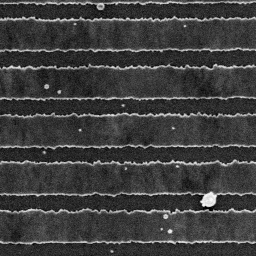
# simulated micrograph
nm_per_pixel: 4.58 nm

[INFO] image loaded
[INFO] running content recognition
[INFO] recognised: lines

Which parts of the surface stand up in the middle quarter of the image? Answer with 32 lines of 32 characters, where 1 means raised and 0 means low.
00000011111000000010100111100000
11111111111111111111111111111111
11111111111111111111111111111111
11111111111111111111111111111111
11111111111111111111111111111111
11111111111111111111111111111111
11111111111111111111111111111111
11111111111111111111111111111111
11111111111111111111111111111111
00000000000000000000000000000000
00000000000000000000000000000000
00000000000000000000000000000000
00100010000001110110010110111000
11111111111111111111111111111111
11111111111111111111111111111111
11111111111111111111111111111111
11111111111111111111111111111111
11111111111111111111111111111111
11111111111111111111111111111111
11111111111111111111111111111111
11111111111111110111101111111111
00000000000000000000000000000000
00000000000000000000000000000000
00000000000000000000000000000000
11010000100010010000001100111100
11111111111111111111111111111111
11111111111111111111111111111111
11111111111111111111111111111111
11111111111111111111111111111111
11111111111111111111111111111111
11111111111111111111111111111111
11111111111111111111111111111111